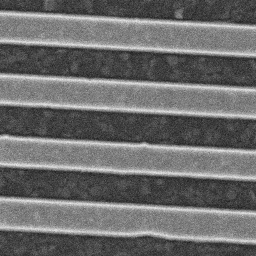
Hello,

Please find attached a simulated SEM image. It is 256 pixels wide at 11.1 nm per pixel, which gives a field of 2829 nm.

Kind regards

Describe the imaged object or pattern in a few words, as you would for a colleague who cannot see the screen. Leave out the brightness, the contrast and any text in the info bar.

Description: one or a few lines or trenches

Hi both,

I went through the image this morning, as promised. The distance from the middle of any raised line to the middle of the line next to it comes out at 685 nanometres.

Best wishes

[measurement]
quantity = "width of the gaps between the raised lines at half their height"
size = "32.4 px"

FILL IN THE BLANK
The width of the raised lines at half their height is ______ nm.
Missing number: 322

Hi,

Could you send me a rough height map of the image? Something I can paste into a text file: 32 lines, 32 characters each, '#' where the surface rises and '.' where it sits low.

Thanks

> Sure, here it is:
................................
................................
##################..............
################################
################################
.....###########################
......................#.########
................................
................................
###.............................
####################............
################################
################################
...........#####################
............................####
................................
................................
#######.........................
#########################.......
################################
################################
..............##################
................................
................................
................................
##############..................
################################
################################
################################
....................############
................................
................................